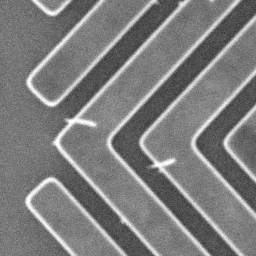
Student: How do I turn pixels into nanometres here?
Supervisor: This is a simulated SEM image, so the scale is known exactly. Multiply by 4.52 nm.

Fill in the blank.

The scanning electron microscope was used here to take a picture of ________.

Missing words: groups of lines, slits or small figures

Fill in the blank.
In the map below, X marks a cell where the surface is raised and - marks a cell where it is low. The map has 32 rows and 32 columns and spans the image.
-----XXX----XXXXXXX----XXXXXXX--
------X----XXXXXXX----XXXXXXX---
----------XXXXXXX----XXXXXXX----
---------XXXXXXX----XXXXXXX----X
--------XXXXXXX----XXXXXXX----XX
-------XXXXXXX----XXXXXXX----XXX
-------XXXXXX----XXXXXXX----XXXX
------XXXXXX----XXXXXXX----XXXXX
-----XXXXXX----XXXXXXX----XXXXXX
----XXXXXX----XXXXXXX----XXXXXXX
----XXXXXX---XXXXXXX----XXXXXXX-
----XXXXX---XXXXXXX----XXXXXXX--
-----XXX----XXXXXX----XXXXXXX---
-----------XXXXXX----XXXXXXX----
----------XXXXXX----XXXXXXX----X
---------XXXXXX----XXXXXXX----XX
--------XXXXXX----XXXXXXX----XXX
-------XXXXXXX----XXXXXX----XXXX
-------XXXXXXX----XXXXXX----XXXX
--------XXXXXXX----XXXXXX----XXX
---------XXXXXXX---XXXXXXX----XX
----------XXXXXXX---XXXXXXX----X
------X----XXXXXXX---XXXXXXX----
-----XXX----XXXXXX----XXXXXXX---
----XXXXX----XXXXXX----XXXXXXX--
----XXXXXX----XXXXXX----XXXXXXX-
----XXXXXXX----XXXXXX----XXXXXXX
-----XXXXXXX---XXXXXXX----XXXXXX
------XXXXXXX---XXXXXXX----XXXXX
-------XXXXXX----XXXXXXX----XXXX
--------XXXXXX----XXXXXXX----XXX
---------XXXXXX----XXXXXXX----XX